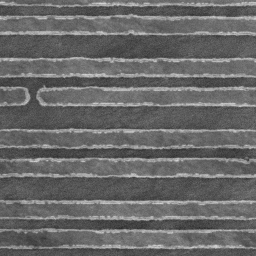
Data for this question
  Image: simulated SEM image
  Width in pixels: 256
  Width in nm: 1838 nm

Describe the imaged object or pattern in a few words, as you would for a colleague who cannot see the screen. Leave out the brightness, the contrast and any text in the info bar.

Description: parallel lines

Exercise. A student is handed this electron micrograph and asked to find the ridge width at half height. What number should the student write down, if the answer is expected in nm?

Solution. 129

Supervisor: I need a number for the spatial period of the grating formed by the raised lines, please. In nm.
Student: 255